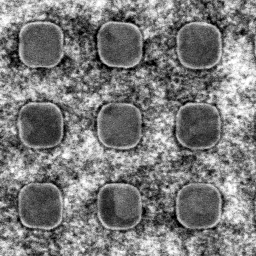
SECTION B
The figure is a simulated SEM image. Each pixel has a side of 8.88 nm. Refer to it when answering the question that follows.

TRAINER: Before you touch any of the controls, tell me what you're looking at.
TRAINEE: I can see a regular array of raised bodies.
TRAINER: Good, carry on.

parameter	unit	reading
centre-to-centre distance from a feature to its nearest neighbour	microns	0.701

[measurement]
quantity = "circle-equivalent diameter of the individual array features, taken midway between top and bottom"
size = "415 nm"